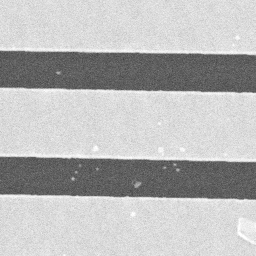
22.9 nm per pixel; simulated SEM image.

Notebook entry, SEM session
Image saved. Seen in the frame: lines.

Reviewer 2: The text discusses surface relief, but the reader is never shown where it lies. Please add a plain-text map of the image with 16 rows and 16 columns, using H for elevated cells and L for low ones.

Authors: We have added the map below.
HHHHHHHHHHHHHHHH
HHHHHHHHHHHHHHHH
HHHHHHHHHHHHHHHH
LLLLLLLLLLLLLLLL
LLLLLLLLLLLLLLLL
LLLLLLLLLLLLLLLL
HHHHHHHHHHHHHHHH
HHHHHHHHHHHHHHHH
HHHHHHHHHHHHHHHH
HHHHHHHHHHHHHHHH
LLLLLLLLLLLLLLLL
LLLLLLLLLLLLLLLL
HHHHHHHHHHHHHHHL
HHHHHHHHHHHHHHHH
HHHHHHHHHHHHHHHH
HHHHHHHHHHHHHHHH